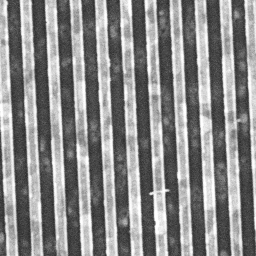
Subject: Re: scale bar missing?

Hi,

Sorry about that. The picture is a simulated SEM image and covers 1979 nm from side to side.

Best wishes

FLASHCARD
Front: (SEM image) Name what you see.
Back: parallel lines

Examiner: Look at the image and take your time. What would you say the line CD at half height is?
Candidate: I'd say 74.3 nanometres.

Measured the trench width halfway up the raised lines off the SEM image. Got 0.118 micrometres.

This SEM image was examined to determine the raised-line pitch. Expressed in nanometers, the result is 193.